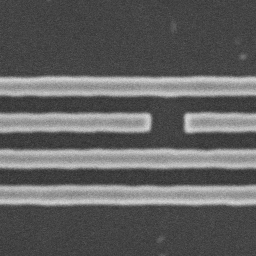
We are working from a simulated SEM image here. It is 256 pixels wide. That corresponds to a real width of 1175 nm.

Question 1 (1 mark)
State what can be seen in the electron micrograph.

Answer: groups of lines, slits or small figures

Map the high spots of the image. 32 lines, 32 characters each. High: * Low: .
................................
................................
................................
................................
................................
................................
................................
................................
................................
................................
********************************
********************************
................................
................................
*******************....*********
*******************....*********
*......................**.......
................................
................................
********************************
********************************
................................
................................
********************************
********************************
.............................*..
................................
................................
................................
................................
................................
................................